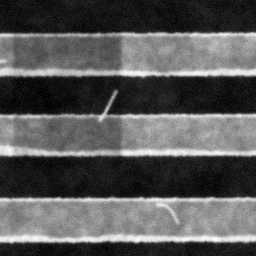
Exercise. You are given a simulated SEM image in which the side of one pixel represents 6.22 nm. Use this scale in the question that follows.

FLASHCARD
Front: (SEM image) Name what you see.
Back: lines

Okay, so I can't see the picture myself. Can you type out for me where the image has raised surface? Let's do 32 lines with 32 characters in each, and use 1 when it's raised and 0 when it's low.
00000000000000000000000000000000
00000000000000000000000000000000
00000000000000000000000000000000
00000000000000000000000000000000
11111111111111111111111111111111
11111111111111111111111111111111
11111111111111111111111111111111
11111111111111111111111111111111
11111111111111111111111111111111
00000000000000000000000000000000
00000000000000000000000000000000
00000000000000000000000000000000
00000000000000000000000000000000
00000000000000000000000000000000
11111111111111111111111111111111
11111111111111111111111111111111
11111111111111111111111111111111
11111111111111111111111111111111
11111111111111111111111111111111
00000000000000000000000000000000
00000000000000000000000000000000
00000000000000000000000000000000
00000000000000000000000000000000
00000000000000000000000000000000
00000000000000000000000000000000
11111111111111111111111111111111
11111111111111111111111111111111
11111111111111111111111111111111
11111111111111111111111111111111
11111111111111111111111111111111
00000000000000000000000000000000
00000000000000000000000000000000